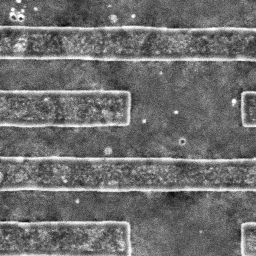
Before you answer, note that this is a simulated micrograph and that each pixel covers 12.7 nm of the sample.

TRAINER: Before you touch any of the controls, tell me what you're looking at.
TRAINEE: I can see wiring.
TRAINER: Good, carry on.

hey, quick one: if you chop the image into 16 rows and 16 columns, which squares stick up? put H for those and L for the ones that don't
LLLLLLLLLLLLLLLL
LLLLLLLLLLLLLLLL
HHHHHHHHHHHHHHHH
HHHHHHHHHHHHHHHH
LLLLLLLLLLLLLLLL
LLLLLLLLLLLLLLLL
HHHHHHHHLLLLLLLH
HHHHHHHHLLLLLLLH
LLLLLLLLLLLLLLLL
LLLLLLLLLLLLLLLL
HHHHHHHHHHHHHHHH
HHHHHHHHHHHHHHHH
LLLLLLLLLLLLLLLL
LLLLLLLLLLLLLLLL
HHHHHHHHLLLLLLLH
HHHHHHHHLLLLLLLH